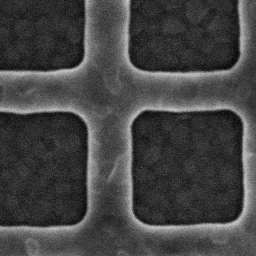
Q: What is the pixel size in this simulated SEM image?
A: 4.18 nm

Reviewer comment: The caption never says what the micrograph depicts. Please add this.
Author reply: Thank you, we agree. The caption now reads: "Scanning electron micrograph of holes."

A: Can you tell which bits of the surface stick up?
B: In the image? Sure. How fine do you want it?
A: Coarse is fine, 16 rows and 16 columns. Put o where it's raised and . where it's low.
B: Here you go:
.....ooo.......o
.....ooo.......o
.....ooo.......o
.....ooo.......o
ooooooooo....ooo
oooooooooooooooo
oooooooooooooooo
.....ooo.......o
......oo.......o
......oo.......o
......oo.......o
......oo.......o
.....ooo.......o
.....ooo.......o
oooooooooooooooo
oooooooooooooooo